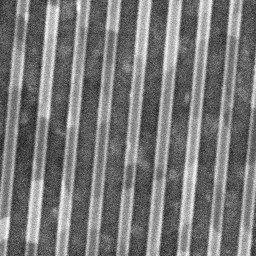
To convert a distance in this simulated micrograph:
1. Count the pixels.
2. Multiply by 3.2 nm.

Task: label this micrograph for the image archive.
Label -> parallel lines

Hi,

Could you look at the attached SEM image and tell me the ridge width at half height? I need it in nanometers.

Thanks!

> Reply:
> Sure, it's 31.8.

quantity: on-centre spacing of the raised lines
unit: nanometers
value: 96.9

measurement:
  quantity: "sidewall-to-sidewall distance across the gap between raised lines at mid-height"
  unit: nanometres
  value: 66.8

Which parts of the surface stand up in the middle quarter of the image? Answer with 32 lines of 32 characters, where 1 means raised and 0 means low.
00011000001100000011000001110000
00111000001100000011000001110000
00110000001100000111000001110000
00110000001100000111000001100000
00110000001100000111000001100000
00110000001100000111000001100000
00110000001100000110000001100000
00110000011100000110000001100000
00110000011000000110000011100000
00110000011000000110000011100000
00110000011000000110000011100000
00110000011000000110000011000000
01110000011000000110000011000000
01100000011000001110000011000000
01100000011000001110000011000000
01100000011000001110000011000000
01100000011000001110000011000001
01100000011000001100000011000001
01100000111000001100000011000001
01100000111000001100000111000001
01100000111000001100000111000001
01100000111000001100000111000001
01100000110000001100000110000001
11100000110000001100000110000001
11000000110000011100000110000001
11000000110000011100000110000001
11000000110000011100000110000001
11000000110000011100000110000011
11000000110000011000000110000011
11000001110000011000000110000011
11000001110000011000001110000011
11000001110000011000001110000011